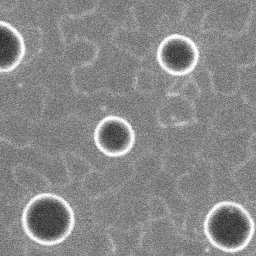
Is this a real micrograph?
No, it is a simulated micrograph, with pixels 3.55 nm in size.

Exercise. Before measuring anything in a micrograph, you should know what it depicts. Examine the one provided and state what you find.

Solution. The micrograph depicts raised bodies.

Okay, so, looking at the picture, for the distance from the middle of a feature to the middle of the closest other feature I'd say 105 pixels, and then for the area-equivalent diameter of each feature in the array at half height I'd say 154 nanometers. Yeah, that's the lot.